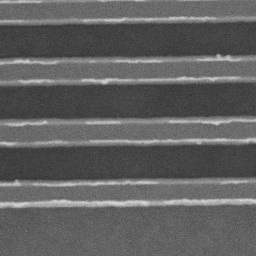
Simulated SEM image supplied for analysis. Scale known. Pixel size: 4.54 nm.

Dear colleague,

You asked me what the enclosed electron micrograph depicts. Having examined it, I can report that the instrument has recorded parallel lines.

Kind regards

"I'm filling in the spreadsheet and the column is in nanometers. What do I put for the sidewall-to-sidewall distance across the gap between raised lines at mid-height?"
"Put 162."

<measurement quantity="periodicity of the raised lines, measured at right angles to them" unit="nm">277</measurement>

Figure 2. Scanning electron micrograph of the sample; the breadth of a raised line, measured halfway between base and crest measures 113 nanometres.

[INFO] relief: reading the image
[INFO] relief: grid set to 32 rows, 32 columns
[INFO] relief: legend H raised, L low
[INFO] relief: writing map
HHHHHHHHHHHHHHHHHHHHHHHHHHHHHHHH
HHHHHHHHHHHHHHHHHHHHHHHHHHHHHHHH
HHHHHHHHHHHHHHHHHHHHHHHHHHHHHHHH
LLLLLLLLLLLLLLLLLLLLLLLLLLLLLLLL
LLLLLLLLLLLLLLLLLLLLLLLLLLLLLLLL
LLLLLLLLLLLLLLLLLLLLLLLLLLLLLLLL
LLLLLLLLLLLLLLLLLLLLLLLLLLLLLLLL
LHHHHHHHHHHHHHHHHHHHHHHHHHHHHHHH
HHHHHHHHHHHHHHHHHHHHHHHHHHHHHHHH
HHHHHHHHHHHHHHHHHHHHHHHHHHHHHHHH
HHHHLLLLLLLLLLLLLLLLLLLLLLLLLLLL
LLLLLLLLLLLLLLLLLLLLLLLLLLLLLLLL
LLLLLLLLLLLLLLLLLLLLLLLLLLLLLLLL
LLLLLLLLLLLLLLLLLLLLLLLLLLLLLLLL
LLLLLLLLLLLLLLLLLLLLLLLLLLLLLLLL
HHHHHHHHHHHHHHHHHHHHHHHHHHHHHHHH
HHHHHHHHHHHHHHHHHHHHHHHHHHHHHHHH
HHHHHHHHHHHHHHHHHHHHHHHHHHHHHHHH
LLLLLLLLLLLLLLLLLLLLLLLLLLLLLLLL
LLLLLLLLLLLLLLLLLLLLLLLLLLLLLLLL
LLLLLLLLLLLLLLLLLLLLLLLLLLLLLLLL
LLLLLLLLLLLLLLLLLLLLLLLLLLLLLLLL
LLLLLLLLLLLLLLLLLLLLLLLHHHHHHHHH
HHHHHHHHHHHHHHHHHHHHHHHHHHHHHHHH
HHHHHHHHHHHHHHHHHHHHHHHHHHHHHHHH
HHHHHHHHHHHHHHHHHHHLHLLLLLLLLLLL
LLLLLLLLLLLLLLLLLLLLLLLLLLLLLLLL
LLLLLLLLLLLLLLLLLLLLLLLLLLLLLLLL
LLLLLLLLLLLLLLLLLLLLLLLLLLLLLLLL
LLLLLLLLLLLLLLLLLLLLLLLLLLLLLLLL
LLLLLLLLLLLLLLLLLLLLLLLLLLLLLLLL
LLLLLLLLLLLLLLLLLLLLLLLLLLLLLLLL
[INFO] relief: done